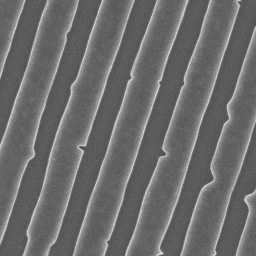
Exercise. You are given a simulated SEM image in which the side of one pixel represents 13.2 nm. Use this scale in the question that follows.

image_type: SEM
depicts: parallel lines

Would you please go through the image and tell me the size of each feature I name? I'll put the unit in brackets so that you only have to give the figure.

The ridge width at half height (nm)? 398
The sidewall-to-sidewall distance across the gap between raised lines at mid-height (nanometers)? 281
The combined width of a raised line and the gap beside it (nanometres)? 680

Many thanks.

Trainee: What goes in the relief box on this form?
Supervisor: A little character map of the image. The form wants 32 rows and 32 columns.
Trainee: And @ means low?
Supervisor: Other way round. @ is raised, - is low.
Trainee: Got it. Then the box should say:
@@@---@@@@---@@@@--@@@@---@@@@--
@@@--@@@@---@@@@---@@@@---@@@@--
@@---@@@@---@@@@---@@@@---@@@---
@@---@@@@---@@@@--@@@@---@@@@---
@@---@@@---@@@@---@@@@---@@@@---
@---@@@@---@@@@---@@@@---@@@---@
@---@@@@---@@@@--@@@@---@@@@---@
@---@@@---@@@@---@@@@---@@@@---@
---@@@@---@@@@---@@@@--@@@@---@@
---@@@@---@@@---@@@@---@@@@---@@
---@@@@--@@@@---@@@@---@@@@---@@
--@@@@---@@@@---@@@@---@@@---@@@
--@@@@---@@@@--@@@@---@@@@---@@@
--@@@@--@@@@---@@@@---@@@@--@@@@
-@@@@---@@@@---@@@@---@@@----@@@
-@@@@---@@@@--@@@@---@@@@---@@@@
-@@@@--@@@@---@@@@---@@@@---@@@@
@@@@---@@@@---@@@@---@@@---@@@@-
@@@@---@@@----@@@---@@@@---@@@@-
@@@@--@@@@---@@@@---@@@@---@@@@-
@@@---@@@@---@@@@---@@@@--@@@@--
@@@---@@@@--@@@@---@@@@----@@@--
@@@---@@@---@@@@---@@@@----@@@--
@@---@@@@---@@@@--@@@@@--@@@@---
@@---@@@@--@@@@---@@@@---@@@@--@
@@---@@@---@@@@---@@@@---@@@@--@
@---@@@@---@@@@---@@@@--@@@@---@
@---@@@@---@@@---@@@@---@@@@---@
@---@@@---@@@@---@@@@---@@@@---@
----@@@---@@@@---@@@---@@@@---@@
---@@@@---@@@---@@@@---@@@@---@@
---@@@---@@@@---@@@@---@@@@---@@